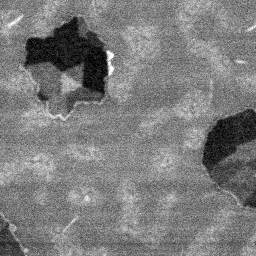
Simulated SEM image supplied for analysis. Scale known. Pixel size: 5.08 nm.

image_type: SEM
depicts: raised bodies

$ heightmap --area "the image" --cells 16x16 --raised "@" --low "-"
----------------
----@@----------
--@@@@----------
--@@@@@---------
--@@@@@---------
--@@@@@---------
---@@-----------
--------------@@
-------------@@@
-------------@@@
-------------@@@
-------------@@@
---------------@
----------------
@---------------
@---------------